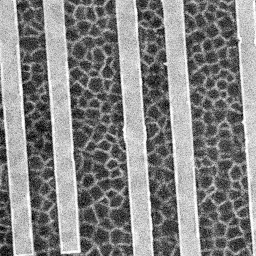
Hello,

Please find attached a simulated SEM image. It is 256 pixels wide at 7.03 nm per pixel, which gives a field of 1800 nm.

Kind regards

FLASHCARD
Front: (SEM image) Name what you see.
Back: parallel lines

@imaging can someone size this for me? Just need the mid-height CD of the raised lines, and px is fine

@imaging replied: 19.4